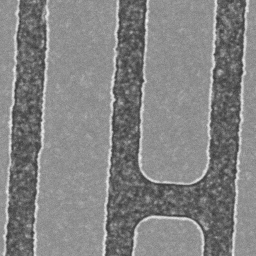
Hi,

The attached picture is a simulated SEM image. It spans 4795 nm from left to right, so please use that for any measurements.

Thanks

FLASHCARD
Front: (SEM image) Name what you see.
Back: one or a few lines or trenches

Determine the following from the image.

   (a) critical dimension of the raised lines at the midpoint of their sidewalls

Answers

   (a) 1300 nanometres